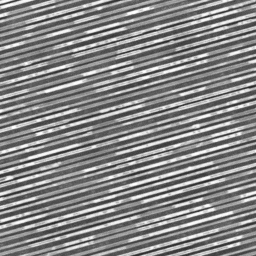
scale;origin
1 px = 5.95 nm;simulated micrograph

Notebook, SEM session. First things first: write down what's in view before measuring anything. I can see parallel lines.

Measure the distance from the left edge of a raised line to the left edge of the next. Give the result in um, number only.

0.0393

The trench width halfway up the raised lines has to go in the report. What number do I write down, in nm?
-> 23.7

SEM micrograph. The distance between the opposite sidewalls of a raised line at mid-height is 17.9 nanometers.